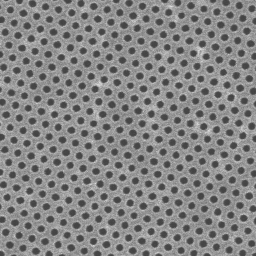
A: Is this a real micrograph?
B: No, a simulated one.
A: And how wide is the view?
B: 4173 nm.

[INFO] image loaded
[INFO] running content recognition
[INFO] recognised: a regular array of holes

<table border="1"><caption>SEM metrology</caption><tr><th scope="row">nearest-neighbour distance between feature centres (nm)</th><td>213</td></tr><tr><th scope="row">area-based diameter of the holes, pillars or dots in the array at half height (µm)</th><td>0.127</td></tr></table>